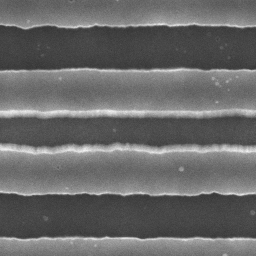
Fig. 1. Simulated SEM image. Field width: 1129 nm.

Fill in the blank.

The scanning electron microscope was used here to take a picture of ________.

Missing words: lines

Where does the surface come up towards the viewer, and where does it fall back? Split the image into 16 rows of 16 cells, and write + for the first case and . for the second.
++++++++++++++++
++++++++++++++++
................
................
++++++++++++++++
++++++++++++++++
++++++++++++++++
++++++++++++++++
++++++++++++++++
++++++++++++++++
++++++++++++++++
++++++++++++++++
................
................
................
++++++++++++++++